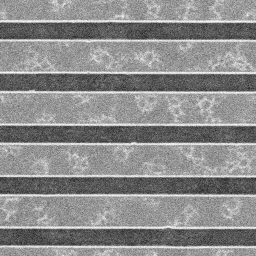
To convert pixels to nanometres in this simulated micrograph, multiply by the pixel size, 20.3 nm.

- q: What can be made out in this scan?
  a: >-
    parallel lines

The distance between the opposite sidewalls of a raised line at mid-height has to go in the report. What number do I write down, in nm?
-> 673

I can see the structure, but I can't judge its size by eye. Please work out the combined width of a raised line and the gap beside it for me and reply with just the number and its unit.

1050 nm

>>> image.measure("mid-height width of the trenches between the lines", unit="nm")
373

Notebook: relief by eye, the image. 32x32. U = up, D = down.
UUUUUUUUUUUUUUUUUUUUUUUUUUUUUUUU
UUUUUUUUUUUUUUUUUUUUUUUUUUUUUUUU
UUUUUUUUUUUUUUUUUUUUUUUUUUUUUUUU
DDDDDDDDDDDDDDDDDDDDDDDDDDDDDDDD
DDDDDDDDDDDDDDDDDDDDDDDDDDDDDDDD
UUUUUUUUUUUUUUUUUUUUUUUUUUUUUUUU
UUUUUUUUUUUUUUUUUUUUUUUUUUUUUUUU
UUUUUUUUUUUUUUUUUUUUUUUUUUUUUUUU
UUUUUUUUUUUUUUUUUUUUUUUUUUUUUUUU
DDDDDDDDDDDDDDDDDDDDDDDDDDDDDDDD
DDDDDDDDDDDDDDDDDDDDDDDDDDDDDDDD
DDDUUDDDDDDDDDDDDDDDDDDDDDDDDDDD
UUUUUUUUUUUUUUUUUUUUUUUUUUUUUUUU
UUUUUUUUUUUUUUUUUUUUUUUUUUUUUUUU
UUUUUUUUUUUUUUUUUUUUUUUUUUUUUUUU
UUUUUUUUUUUUUUUUUUUUUUUUUUUUUUUU
DDDDDDDDDDDDDDDDDDDDDDDDDDDDDDDD
DDDDDDDDDDDDDDDDDDDDDDDDDDDDDDDD
UUUUUUUUUUUUUUUUUUUUUUUUUUUUUUUU
UUUUUUUUUUUUUUUUUUUUUUUUUUUUUUUU
UUUUUUUUUUUUUUUUUUUUUUUUUUUUUUUU
UUUUUUUUUUUUUUUUUUUUUUUUUUUUUUUU
DDDDDDDDDDDDDDDDDDDDDDDDDDDDDDDD
DDDDDDDDDDDDDDDDDDDDDDDDDDDDDDDD
UUUUUUUUUUUUUUUUUUUUUUUUUUUUUUUU
UUUUUUUUUUUUUUUUUUUUUUUUUUUUUUUU
UUUUUUUUUUUUUUUUUUUUUUUUUUUUUUUU
UUUUUUUUUUUUUUUUUUUUUUUUUUUUUUUU
DDDDDDDDDDDDDDDDDDDDDDDDDDUUUUUU
DDDDDDDDDDDDDDDDDDDDDDDDDDDDDDDD
DDDDDDDDDDDDDDDDDDDDDDDDDDDDDDDD
UUUUUUUUUUUUUUUUUUUUUUUUUUUUUUUU